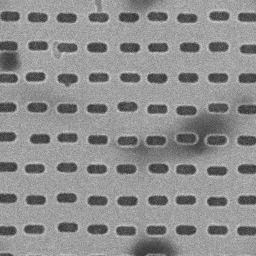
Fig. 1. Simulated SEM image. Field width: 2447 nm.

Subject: a regular array of holes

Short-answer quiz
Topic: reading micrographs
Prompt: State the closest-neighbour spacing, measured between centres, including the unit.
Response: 278 nm